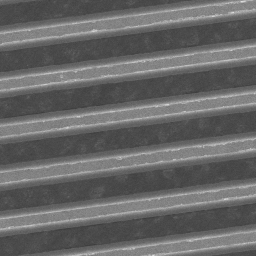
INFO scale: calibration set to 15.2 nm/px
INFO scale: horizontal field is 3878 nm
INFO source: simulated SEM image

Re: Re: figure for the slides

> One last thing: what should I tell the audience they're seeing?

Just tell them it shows parallel lines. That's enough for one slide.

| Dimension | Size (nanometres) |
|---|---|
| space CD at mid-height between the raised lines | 434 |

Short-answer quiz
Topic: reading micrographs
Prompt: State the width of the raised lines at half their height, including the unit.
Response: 267 nanometers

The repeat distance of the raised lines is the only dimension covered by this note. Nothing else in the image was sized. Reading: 696 nanometres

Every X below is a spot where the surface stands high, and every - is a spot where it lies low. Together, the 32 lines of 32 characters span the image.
-------------------------XXXXXXX
-----------------XXXXXXXXXXXXXXX
----------XXXXXXXXXXXXXXXX------
--XXXXXXXXXXXXXXXXX-------------
XXXXXXXXXXX---------------------
XXXX--------------------------XX
-----------------------XXXXXXXXX
---------------XXXXXXXXXXXXXXXXX
--------XXXXXXXXXXXXXXXX--------
XXXXXXXXXXXXXXXXX---------------
XXXXXXXXX-----------------------
XX---------------------------XXX
----------------------XXXXXXXXXX
---------------XXXXXXXXXXXXXXX--
------XXXXXXXXXXXXXXXXX---------
XXXXXXXXXXXXXXXX----------------
XXXXXXXX------------------------
---------------------------XXXXX
--------------------XXXXXXXXXXXX
------------XXXXXXXXXXXXXXXXX---
-----XXXXXXXXXXXXXXXXX----------
XXXXXXXXXXXXXX------------------
XXXXXX--------------------------
--------------------------XXXXXX
-------------------XXXXXXXXXXXXX
-----------XXXXXXXXXXXXXXXXX----
----XXXXXXXXXXXXXXXX------------
XXXXXXXXXXXXX-------------------
XXXXX---------------------------
------------------------XXXXXXXX
-----------------XXXXXXXXXXXXXXX
---------XXXXXXXXXXXXXXXXX------